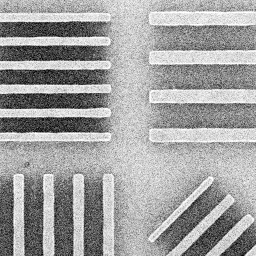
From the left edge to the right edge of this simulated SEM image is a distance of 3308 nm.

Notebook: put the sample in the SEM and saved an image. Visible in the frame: groups of lines, slits or small figures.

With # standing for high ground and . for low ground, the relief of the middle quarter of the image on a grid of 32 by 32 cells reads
###########.....................
................................
................................
................................
................................
####.######.....................
############...............##...
......................##########
......................##########
......................##########
................................
###########.....................
###########.....................
................................
................................
................................
......................##########
###########...........##########
############..........##########
................................
................................
................................
................................
................................
................................
................................
................................
................................
..###.....##....................
..###.....##....................
..###.....##....................
..###.....##....................